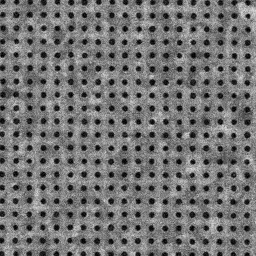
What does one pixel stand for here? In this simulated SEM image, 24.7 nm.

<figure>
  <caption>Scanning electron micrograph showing a regular array of holes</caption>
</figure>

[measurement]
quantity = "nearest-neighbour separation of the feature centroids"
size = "323 nanometers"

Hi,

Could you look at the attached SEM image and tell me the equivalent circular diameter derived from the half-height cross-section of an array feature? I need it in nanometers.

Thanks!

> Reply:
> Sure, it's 158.